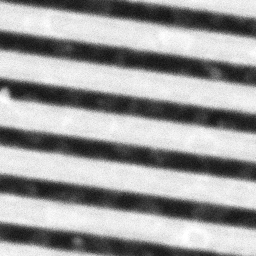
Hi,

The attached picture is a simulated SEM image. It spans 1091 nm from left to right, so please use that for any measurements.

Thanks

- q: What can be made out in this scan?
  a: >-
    parallel lines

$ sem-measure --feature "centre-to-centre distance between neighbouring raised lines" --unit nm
202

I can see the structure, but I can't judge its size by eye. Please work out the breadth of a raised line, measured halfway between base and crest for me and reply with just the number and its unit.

114 nanometers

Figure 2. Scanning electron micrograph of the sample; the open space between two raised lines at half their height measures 0.0859 um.